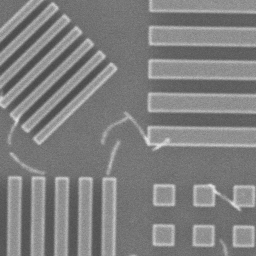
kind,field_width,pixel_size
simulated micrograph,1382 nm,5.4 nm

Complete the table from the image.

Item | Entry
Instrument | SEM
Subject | groups of lines, slits or small figures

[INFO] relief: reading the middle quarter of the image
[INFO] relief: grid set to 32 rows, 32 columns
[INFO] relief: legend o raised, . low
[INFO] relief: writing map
oo...ooo...oo........ooooooooooo
o...ooo...ooo........ooooooooooo
...ooo...ooo.........ooooooooooo
..ooo...ooo...............oooooo
.ooo...ooo......................
ooo...ooo.......................
oo...ooo........................
o...ooo..............ooooo......
...ooo...............ooooooooooo
..ooo................ooooooooooo
.ooo.................ooooooooooo
ooo..................ooooooooooo
oo..............................
o...............................
................................
................................
.....................ooooooooooo
.....................ooooooooooo
.....................ooooooooooo
.....................ooooooooooo
.......................o........
................................
................................
................................
................................
................................
................................
................................
o...............................
o...ooo...ooo...................
o...ooo...ooo..........ooooo....
o...ooo...ooo..........ooooo....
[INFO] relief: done